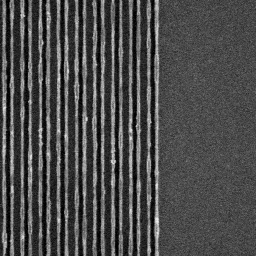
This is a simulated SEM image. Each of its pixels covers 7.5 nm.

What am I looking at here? parallel lines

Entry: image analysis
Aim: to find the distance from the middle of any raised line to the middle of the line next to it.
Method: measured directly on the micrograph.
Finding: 67.1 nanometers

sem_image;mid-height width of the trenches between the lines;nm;44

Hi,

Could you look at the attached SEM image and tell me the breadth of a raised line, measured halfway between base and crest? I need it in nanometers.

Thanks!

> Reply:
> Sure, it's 21.6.